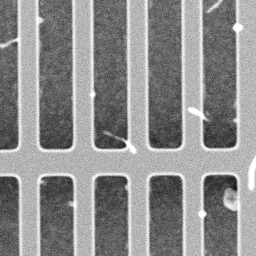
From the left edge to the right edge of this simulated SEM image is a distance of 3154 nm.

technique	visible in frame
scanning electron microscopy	groups of lines, slits or small figures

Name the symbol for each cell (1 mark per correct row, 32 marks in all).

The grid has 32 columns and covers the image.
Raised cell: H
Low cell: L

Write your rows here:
LLHHHLLLLHHLLLLLHHLLLLLHHLLLLLHH
LLHHHLLLLHHHLLLLHHLLLLLHHLLLLLHH
LLHHHLLLLHHHLLLLHHLLLLLHHLLLLLHH
LLHHHLLLLHHHLLLLHHLLLLLHHLLLLHHH
LLHHHLLLLHHHLLLLHHLLLLLHHLLLLLHH
LLHHHLLLLHHHLLLLHHLLLLLHHLLLLLHH
LLHHHLLLLHHHLLLLHHLLLLLHHLLLLLHH
LLHHHLLLLHHHLLLLHHLLLLLHHLLLLLHH
LLHHHLLLLHHHLLLLHHLLLLLHHLLLLLHH
LLHHHLLLLHHHLLLLHHLLLLLHHLLLLLHH
LLHHHLLLLHHHLLLLHHLLLLLHHLLLLLHH
LLHHHLLLLHHHLLLLHHLLLLLHHLLLLLHH
LLHHHLLLLHHHLLLLHHLLLLLHHLLLLLHH
LLHHHLLLLHHHLLLLHHLLLLLHHLLLLLHH
LLHHHLLLLHHHLLLLHHLLLLLHHLLLLLHH
LLLHHLLLLHHHLLLLHHLLLLLHHLLLLLHH
LLLHHLLLLHHHLLLLHHLLLLLHHLLLLLHH
LLHHHLLLLHHHLLLLHHLLLLLHHLLLLLHH
LLHHHLLLLHHHLLLLHHHLLLHHHHLLLHHH
HHHHHHHHHHHHHHHHHHHHHHHHHHHHHHHH
HHHHHHHHHHHHHHHHHHHHHHHHHHHHHHHH
HHHHHHHHHHHHHHHHHHHHHHHHHHHHHHHH
LLHHHLLLLHHHLLLLHHHLLLLHHLLLLLHH
LLLHHLLLLHHHLLLLHHLLLLLHHLLLLLHH
LLLHHLLLLHHHLLLLHHLLLLLHHLLLLLHH
LLLHHLLLLHHHLLLLHHLLLLLHHLLLLLHH
LLLHHLLLLHHHLLLLHHLLLLLHHHLLLLHH
LLLHHLLLLHHHLLLLHHLLLLLHHLLLLLHH
LLLHHLLLLHHHLLLLHHLLLLLHHLLLLLHH
LLLHHLLLLHHHLLLLHHLLLLLHHLLLLLHH
LLLHHLLLLHHHLLLLHHLLLLLHHLLLLLHH
LLLHHLLLLHHHLLLLHHLLLLLHHLLLLLHH